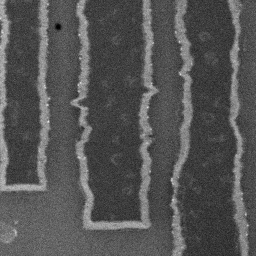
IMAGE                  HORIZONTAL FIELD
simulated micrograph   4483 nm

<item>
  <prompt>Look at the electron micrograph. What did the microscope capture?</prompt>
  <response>one or a few lines or trenches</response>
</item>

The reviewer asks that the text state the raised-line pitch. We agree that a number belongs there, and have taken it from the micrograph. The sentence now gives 1.64 um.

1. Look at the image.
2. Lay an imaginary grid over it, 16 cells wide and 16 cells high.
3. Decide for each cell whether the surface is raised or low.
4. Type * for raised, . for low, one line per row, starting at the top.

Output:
***..****..****.
***..****..****.
***..****..****.
***..****...***.
***..****...***.
***..****...***.
***..****...***.
***..****...***.
***..****...***.
***..****...***.
***..****..****.
***..****..****.
......***..****.
.....****..****.
...........****.
...........****.